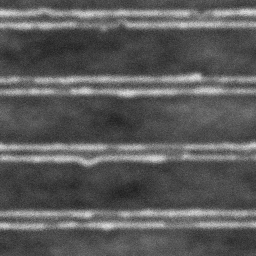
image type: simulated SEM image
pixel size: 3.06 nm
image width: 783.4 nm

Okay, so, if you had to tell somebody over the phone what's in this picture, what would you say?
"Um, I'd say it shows one or a few lines or trenches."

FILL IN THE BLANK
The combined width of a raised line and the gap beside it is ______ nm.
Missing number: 204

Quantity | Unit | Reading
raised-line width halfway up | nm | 47.5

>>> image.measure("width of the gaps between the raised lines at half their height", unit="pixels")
51.5